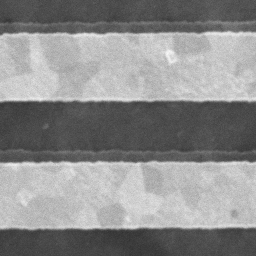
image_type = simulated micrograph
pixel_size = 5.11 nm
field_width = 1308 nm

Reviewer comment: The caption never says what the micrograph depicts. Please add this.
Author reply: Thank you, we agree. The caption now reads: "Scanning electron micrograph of lines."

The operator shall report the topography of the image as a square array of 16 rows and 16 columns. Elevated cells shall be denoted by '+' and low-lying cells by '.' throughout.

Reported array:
................
................
++++++++++++++++
++++++++++++++++
++++++++++++++++
++++++++++++++++
................
................
................
................
++++++++++++++++
++++++++++++++++
++++++++++++++++
++++++++++++++++
................
................